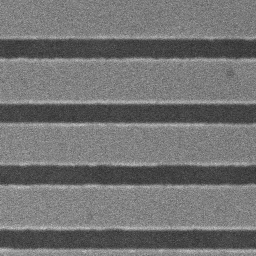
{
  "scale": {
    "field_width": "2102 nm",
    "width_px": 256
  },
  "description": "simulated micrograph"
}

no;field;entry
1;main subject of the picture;lines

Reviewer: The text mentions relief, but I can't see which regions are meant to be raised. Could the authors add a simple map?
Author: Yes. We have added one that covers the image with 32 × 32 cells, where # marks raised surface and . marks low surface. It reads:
################################
################################
################################
################################
################################
................................
................................
######.#.#.#...#####.########.##
################################
################################
################################
################################
################################
................................
................................
................................
################################
################################
################################
################################
################################
................................
................................
################################
################################
################################
################################
################################
################################
................................
................................
################################